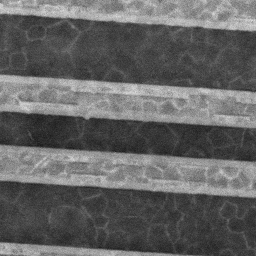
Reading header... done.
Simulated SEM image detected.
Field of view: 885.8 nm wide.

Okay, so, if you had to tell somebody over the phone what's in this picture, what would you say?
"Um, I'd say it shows one or a few lines or trenches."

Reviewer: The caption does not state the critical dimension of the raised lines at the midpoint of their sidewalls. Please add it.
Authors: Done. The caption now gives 0.102 µm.